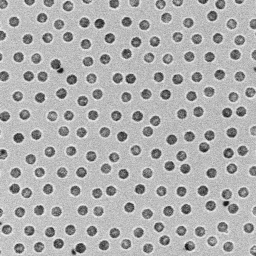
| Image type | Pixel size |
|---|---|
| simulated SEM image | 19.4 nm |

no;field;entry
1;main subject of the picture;a regular array of holes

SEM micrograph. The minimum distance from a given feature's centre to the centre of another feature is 336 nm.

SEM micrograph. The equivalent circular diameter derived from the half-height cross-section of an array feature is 210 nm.